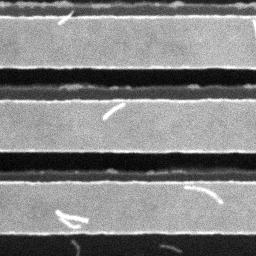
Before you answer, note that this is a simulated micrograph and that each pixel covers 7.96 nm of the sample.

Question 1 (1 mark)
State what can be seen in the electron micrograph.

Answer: lines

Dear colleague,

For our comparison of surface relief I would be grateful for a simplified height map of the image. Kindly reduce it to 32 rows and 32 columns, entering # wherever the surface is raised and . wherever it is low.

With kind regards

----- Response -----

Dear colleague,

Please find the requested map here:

................................
................................
################################
################################
################################
################################
################################
################################
##########################.#####
................................
................................
................................
#........#....########..########
################################
################################
################################
################################
################################
################################
................................
................................
................................
................................
################################
################################
################################
################################
################################
################################
................................
................................
................................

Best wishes